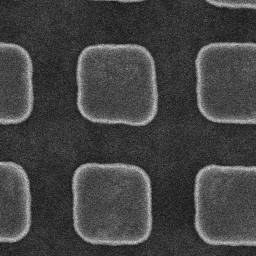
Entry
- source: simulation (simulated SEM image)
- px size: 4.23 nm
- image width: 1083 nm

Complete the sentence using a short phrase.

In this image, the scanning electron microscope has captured raised bodies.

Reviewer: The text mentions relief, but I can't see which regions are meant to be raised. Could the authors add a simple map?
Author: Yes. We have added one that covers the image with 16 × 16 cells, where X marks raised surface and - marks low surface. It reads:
----------------
----------------
----------------
XX---XXXX---XXXX
XX---XXXXX--XXXX
XX---XXXXX--XXXX
XX---XXXXX--XXXX
X-----XXX----XXX
----------------
----------------
X----XXX-----XXX
XX---XXXX---XXXX
XX---XXXX---XXXX
XX---XXXX---XXXX
XX---XXXX---XXXX
----------------